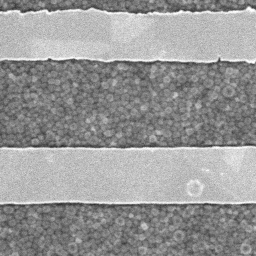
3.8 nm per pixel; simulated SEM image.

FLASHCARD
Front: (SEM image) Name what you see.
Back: one or a few lines or trenches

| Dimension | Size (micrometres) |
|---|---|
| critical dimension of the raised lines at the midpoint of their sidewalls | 0.202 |